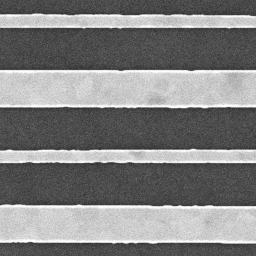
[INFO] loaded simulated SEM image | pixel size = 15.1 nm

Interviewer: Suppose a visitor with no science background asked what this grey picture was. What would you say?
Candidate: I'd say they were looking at lines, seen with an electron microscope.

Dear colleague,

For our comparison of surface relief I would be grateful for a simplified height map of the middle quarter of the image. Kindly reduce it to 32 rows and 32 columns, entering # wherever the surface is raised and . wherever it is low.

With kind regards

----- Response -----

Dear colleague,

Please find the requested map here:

................................
................................
################################
################################
################################
################################
################################
################################
################################
################################
.###############################
................................
................................
................................
................................
................................
................................
................................
................................
................................
................................
...............................#
################################
################################
########.##..###.####.##########
................................
................................
................................
................................
................................
................................
................................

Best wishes